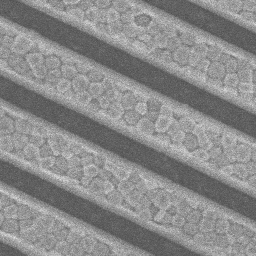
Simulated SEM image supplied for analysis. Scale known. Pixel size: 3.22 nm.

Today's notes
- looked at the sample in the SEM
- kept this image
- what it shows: one or a few lines or trenches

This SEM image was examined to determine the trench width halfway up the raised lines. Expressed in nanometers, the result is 85.6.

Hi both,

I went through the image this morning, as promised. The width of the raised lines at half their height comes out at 155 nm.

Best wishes